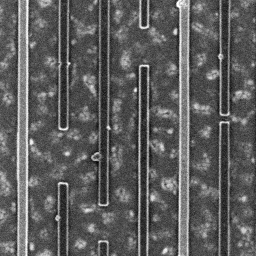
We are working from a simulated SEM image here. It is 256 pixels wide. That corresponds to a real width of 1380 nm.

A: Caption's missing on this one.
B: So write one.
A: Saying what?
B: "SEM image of parallel lines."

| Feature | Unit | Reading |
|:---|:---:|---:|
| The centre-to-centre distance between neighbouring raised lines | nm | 217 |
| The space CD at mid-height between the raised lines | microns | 0.168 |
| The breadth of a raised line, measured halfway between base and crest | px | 9.37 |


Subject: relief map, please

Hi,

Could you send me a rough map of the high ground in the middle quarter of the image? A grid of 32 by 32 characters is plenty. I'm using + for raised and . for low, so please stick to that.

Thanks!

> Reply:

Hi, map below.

+........++........++........++.
+........++........++........++.
+........++........++........++.
+........++........++........++.
+........++........++........++.
+........++........++........++.
+........++........++........++.
+........++........++........++.
+........++........++........++.
+........++........++........++.
+........++........++........++.
+........++........++........++.
+........++........++........++.
+........++........++........++.
+........++........++........++.
+........++........++........++.
.........++........++........++.
.........++........++........++.
.........++........++........++.
.........++........++........++.
.........++........++........++.
.........++........++........++.
........+++........++........++.
.......++++........++........++.
.........++........++........++.
.........++........++........++.
.........++........++........++.
.........++........++........++.
.........++........++........++.
.........++........++........++.
+........++........++........++.
+........++........++........++.